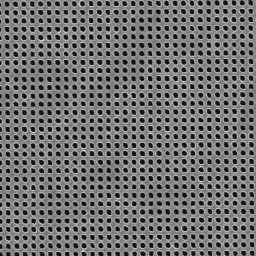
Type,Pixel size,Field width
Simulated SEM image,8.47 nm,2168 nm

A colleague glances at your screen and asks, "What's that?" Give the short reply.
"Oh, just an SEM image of a regular array of holes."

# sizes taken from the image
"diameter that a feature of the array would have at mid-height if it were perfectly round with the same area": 42.7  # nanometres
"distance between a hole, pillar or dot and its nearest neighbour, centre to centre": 68.6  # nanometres